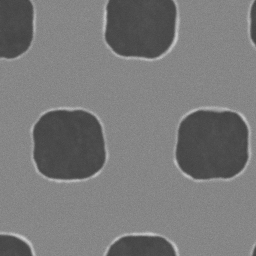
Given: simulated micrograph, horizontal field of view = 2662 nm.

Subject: holes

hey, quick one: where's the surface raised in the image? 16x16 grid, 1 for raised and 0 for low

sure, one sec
0011111000011111
0011111000011111
0011111000011111
0111111100111111
1111111111111111
1111111111111111
1111111111111111
1100001111100001
1100001111100000
1100000111100000
1100001111100001
1111111111111111
1111111111111111
1111111111111111
1111111111111111
0011111000011111